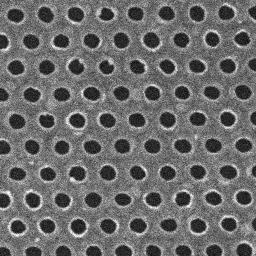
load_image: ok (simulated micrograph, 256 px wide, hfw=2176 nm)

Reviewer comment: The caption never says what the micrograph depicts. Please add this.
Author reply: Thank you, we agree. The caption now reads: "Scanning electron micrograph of a regular array of holes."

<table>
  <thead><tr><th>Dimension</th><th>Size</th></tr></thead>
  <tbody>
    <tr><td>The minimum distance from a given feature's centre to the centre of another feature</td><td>252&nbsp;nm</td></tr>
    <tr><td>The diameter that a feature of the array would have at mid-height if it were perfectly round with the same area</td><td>132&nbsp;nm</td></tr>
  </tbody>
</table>